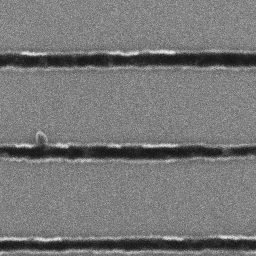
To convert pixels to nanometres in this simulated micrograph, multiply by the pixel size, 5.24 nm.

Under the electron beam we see one or a few lines or trenches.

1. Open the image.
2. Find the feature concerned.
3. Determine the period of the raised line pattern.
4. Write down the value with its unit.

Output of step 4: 484 nm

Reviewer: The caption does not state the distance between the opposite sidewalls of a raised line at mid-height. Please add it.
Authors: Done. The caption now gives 16.3 px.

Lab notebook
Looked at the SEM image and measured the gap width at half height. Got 0.397 µm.